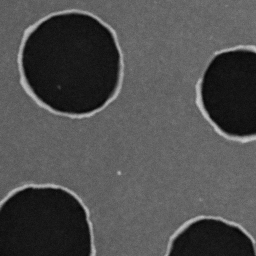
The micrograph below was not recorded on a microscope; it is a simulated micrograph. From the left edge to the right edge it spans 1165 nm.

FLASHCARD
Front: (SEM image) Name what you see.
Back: holes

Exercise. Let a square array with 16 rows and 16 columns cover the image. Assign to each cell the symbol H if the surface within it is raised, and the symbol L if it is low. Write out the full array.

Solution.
HHHHHHHHHHHHHHHH
HHHLLLHHHHHHHHHH
HHLLLLLHHHHHHHHH
HLLLLLLHHHHHHHLL
HHLLLLLHHHHHHLLL
HHLLLLLHHHHHHLLL
HHHLLLHHHHHHHLLL
HHHHHHHHHHHHHLLL
HHHHHHHHHHHHHHHH
HHHHHHHHHHHHHHHH
HHHHHHHHHHHHHHHH
HHHHHHHHHHHHHHHH
HLLLLHHHHHHHHHHH
LLLLLHHHHHHHHHHH
LLLLLLHHHHHLLLLH
LLLLLLHHHHHLLLLL